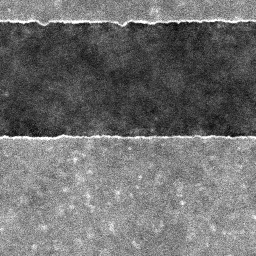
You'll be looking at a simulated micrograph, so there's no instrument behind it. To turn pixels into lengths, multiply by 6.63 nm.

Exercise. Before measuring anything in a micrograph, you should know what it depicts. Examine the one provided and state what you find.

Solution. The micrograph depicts one or a few lines or trenches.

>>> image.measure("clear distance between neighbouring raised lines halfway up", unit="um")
0.76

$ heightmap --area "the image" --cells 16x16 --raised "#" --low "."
################
.......#........
................
................
................
................
................
................
......#.........
################
################
################
################
################
################
################